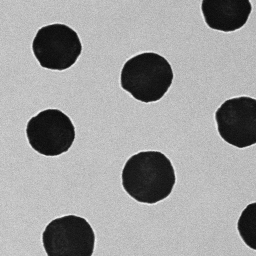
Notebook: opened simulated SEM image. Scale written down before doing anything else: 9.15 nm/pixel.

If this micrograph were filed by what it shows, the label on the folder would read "holes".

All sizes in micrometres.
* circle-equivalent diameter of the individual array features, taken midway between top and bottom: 0.447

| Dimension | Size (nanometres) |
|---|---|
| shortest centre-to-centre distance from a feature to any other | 829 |